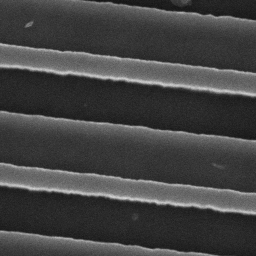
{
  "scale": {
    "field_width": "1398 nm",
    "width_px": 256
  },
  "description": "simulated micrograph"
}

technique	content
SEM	lines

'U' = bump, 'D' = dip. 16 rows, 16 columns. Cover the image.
UUUUUUUUUDDDDDDD
UUUUUUUUUUUUUUUU
UUUUUUUUUUUUUUUU
UUUUUUUUUUUUUUUU
DDDUUUUUUUUUUUUU
DDDDDDDDDDDDUUUU
DDDDDDDDDDDDDDDD
UUUUDDDDDDDDDDDD
UUUUUUUUUUUUUDDD
UUUUUUUUUUUUUUUU
UUUUUUUUUUUUUUUU
UUUUUUUUUUUUUUUU
DDDDDDDDDUUUUUUU
DDDDDDDDDDDDDDDD
DDDDDDDDDDDDDDDD
UUUUUUUUUDDDDDDD